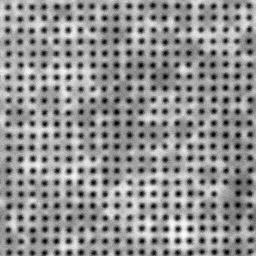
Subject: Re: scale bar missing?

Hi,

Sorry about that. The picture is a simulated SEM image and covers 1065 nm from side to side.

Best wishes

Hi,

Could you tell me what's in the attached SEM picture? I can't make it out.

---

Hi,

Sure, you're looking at a regular array of holes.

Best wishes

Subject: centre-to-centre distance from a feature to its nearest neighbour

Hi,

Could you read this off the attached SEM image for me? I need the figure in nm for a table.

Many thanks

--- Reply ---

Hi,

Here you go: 46.5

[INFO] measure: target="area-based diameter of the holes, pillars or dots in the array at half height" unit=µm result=0.021